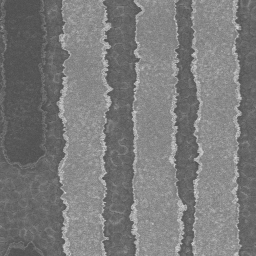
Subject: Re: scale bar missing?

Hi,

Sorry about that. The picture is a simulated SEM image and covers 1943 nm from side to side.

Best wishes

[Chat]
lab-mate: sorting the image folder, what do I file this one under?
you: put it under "one or a few lines or trenches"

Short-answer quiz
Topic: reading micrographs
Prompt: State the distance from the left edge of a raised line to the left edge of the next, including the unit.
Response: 494 nm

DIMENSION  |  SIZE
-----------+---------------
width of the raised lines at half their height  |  0.321 microns